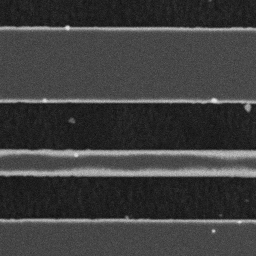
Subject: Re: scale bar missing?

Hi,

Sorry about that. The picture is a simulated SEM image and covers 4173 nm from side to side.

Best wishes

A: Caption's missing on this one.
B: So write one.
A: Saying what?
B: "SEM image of lines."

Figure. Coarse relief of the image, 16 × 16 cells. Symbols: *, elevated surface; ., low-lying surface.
................
................
****************
****************
****************
****************
................
................
................
****************
****************
................
................
................
****************
****************